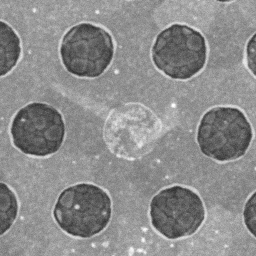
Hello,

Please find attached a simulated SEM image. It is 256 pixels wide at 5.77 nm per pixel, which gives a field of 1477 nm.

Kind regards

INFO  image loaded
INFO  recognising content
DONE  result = holes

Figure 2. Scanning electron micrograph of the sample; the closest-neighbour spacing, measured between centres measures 533 nanometres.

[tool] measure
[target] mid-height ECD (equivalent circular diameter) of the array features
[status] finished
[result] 319 nm